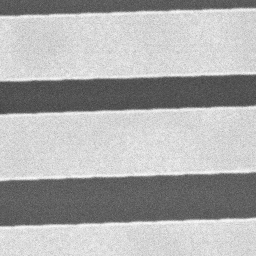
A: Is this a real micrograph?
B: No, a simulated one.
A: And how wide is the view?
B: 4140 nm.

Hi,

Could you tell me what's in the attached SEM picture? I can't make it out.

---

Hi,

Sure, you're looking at lines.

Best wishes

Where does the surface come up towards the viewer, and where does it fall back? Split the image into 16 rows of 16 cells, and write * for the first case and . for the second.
................
****************
****************
****************
****************
................
................
****************
****************
****************
****************
................
................
................
****************
****************